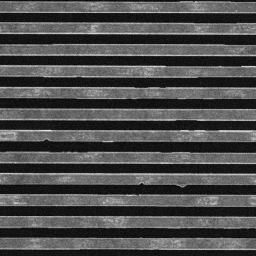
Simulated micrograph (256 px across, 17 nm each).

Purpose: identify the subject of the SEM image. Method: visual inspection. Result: parallel lines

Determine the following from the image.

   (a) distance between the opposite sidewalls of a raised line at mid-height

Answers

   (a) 0.176 microns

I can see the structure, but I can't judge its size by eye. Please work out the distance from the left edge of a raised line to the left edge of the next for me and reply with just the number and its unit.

0.365 micrometres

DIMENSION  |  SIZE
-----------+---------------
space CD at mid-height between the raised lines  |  191 nanometres